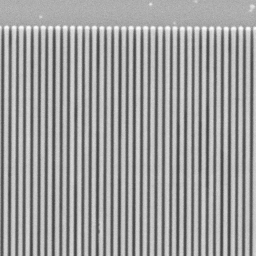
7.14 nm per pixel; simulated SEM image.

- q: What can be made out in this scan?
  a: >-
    parallel lines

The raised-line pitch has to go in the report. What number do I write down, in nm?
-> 52.3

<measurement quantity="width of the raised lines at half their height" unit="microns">0.0294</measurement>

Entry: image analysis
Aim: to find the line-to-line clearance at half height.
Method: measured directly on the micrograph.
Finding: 24.1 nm